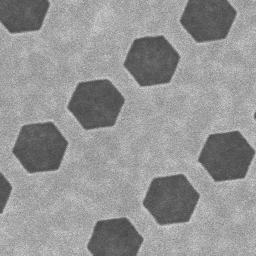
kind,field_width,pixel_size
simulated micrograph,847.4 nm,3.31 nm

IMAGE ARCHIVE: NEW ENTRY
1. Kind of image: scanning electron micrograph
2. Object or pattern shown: holes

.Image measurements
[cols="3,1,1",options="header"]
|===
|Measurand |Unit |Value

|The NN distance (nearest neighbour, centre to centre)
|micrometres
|0.234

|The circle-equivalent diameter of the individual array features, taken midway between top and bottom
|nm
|172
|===